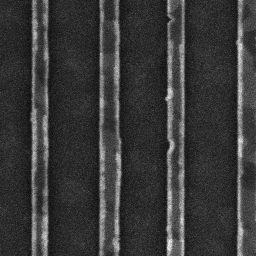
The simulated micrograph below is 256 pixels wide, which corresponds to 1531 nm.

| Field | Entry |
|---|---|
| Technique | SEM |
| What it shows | one or a few lines or trenches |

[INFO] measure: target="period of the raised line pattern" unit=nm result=406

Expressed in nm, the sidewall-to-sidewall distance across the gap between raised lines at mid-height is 318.